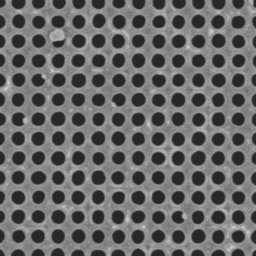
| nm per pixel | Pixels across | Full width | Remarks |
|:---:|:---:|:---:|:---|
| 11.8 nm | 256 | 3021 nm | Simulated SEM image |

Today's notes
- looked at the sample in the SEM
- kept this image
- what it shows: a regular array of holes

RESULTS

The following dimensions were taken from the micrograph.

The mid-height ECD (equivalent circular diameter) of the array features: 160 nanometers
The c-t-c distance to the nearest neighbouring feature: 227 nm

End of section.